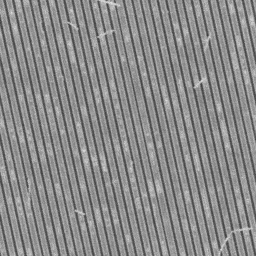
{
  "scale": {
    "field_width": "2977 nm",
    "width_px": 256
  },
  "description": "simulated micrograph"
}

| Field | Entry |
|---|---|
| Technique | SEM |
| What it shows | parallel lines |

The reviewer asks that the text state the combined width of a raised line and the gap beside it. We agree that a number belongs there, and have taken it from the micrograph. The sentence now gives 96.7 nanometres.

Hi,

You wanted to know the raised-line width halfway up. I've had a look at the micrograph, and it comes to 59.7 nm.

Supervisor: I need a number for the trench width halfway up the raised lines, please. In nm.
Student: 39.8